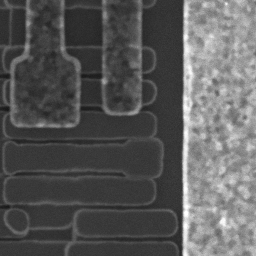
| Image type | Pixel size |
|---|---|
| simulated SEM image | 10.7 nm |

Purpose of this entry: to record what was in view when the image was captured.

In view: wiring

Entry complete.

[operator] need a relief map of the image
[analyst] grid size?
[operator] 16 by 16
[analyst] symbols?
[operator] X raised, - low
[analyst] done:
--XX--XXX---XXXX
--XX---XX---XXXX
--XX--XXX---XXXX
-XXX--XXX---XXXX
-XXXX-XXX---XXXX
-XXXX-XXX---XXXX
-XXXX-XXX---XXXX
-XXXX-------XXXX
------------XXXX
------------XXXX
------------XXXX
------------XXXX
------------XXXX
------------XXXX
------------XXXX
------------XXXX